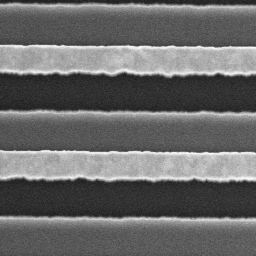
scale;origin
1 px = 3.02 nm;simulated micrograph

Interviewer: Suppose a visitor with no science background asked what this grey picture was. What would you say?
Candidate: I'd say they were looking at lines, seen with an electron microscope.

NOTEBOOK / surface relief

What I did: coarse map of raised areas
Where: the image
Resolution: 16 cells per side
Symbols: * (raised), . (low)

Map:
****************
****************
****************
****************
.***************
................
................
****************
****************
****************
****************
................
................
................
****************
****************